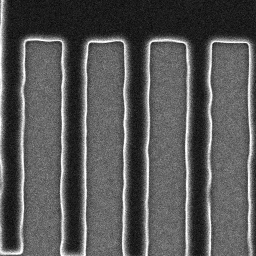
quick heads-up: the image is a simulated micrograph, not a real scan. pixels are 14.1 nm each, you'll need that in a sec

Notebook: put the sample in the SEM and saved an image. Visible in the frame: groups of lines, slits or small figures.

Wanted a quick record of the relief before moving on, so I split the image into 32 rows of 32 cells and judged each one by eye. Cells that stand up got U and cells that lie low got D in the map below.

UUUUUUUUUUUUUUUUUUUUUUUUUUUUUUUU
UUUUUUUUUUUUUUUUUUUUUUUUUUUUUUUU
UUUUUUUUUUUUUUUUUUUUUUUUUUUUUUUU
UUUUUUUUUUUUUUUUUUUUUUUUUUUUUUUU
UUUUUUUUUUUUUUUUUUUUUUUUUUUUUUUU
UUUDDDDDUUUDDDDUUUUDDDDUUUUDDDDU
UUUDDDDDUUUDDDDDUUUDDDDUUUDDDDDU
UUUDDDDDUUUDDDDDUUUDDDDUUUDDDDDU
UUUDDDDDUUUDDDDDUUUDDDDDUUDDDDDU
UUUDDDDDUUUDDDDDUUUDDDDDUUDDDDDU
UUUDDDDDUUUDDDDDUUUDDDDDUUDDDDDU
UUUDDDDDUUUDDDDUUUUDDDDDUUDDDDDU
UUUDDDDDUUUDDDDDUUUDDDDDUUDDDDDU
UUUDDDDDUUUDDDDDUUUDDDDDUUDDDDDU
UUUDDDDDUUUDDDDDUUUDDDDUUUDDDDDU
UUUDDDDDUUUDDDDDUUUDDDDUUUDDDDDU
UUUDDDDDUUUDDDDDUUUDDDDUUUDDDDDU
UUUDDDDDUUUDDDDDUUUDDDDUUUDDDDDU
UUUDDDDDUUUDDDDUUUDDDDDUUUDDDDDU
UUUDDDDDUUUDDDDUUUDDDDDUUUDDDDDU
UUUDDDDDUUUDDDDDUUDDDDDUUUDDDDDU
UUUDDDDDUUUDDDDDUUDDDDDUUUDDDDDU
UUUDDDDDUUUDDDDDUUDDDDDUUUDDDDDU
UUUDDDDDUUUDDDDUUUDDDDDUUUDDDDDU
UUUDDDDDUUUDDDDUUUDDDDDUUUDDDDDU
UUUDDDDDUUUDDDDUUUDDDDDUUUDDDDDU
UUUDDDDDUUUDDDDUUUDDDDDUUUDDDDDU
UUUDDDDDUUUDDDDUUUDDDDDUUUDDDDDU
UUUDDDDDUUUDDDDUUUDDDDDUUUDDDDDU
UUUDDDDDUUUDDDDUUUDDDDDUUUDDDDDU
UUUDDDDDUUUDDDDUUUDDDDDUUUDDDDDU
UUUDDDDDUUUDDDDUUUDDDDDUUUDDDDDU